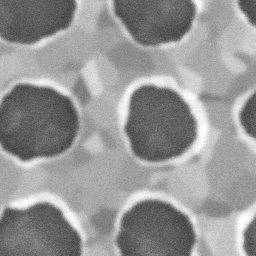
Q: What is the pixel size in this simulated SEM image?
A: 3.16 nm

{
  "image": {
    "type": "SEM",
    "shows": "holes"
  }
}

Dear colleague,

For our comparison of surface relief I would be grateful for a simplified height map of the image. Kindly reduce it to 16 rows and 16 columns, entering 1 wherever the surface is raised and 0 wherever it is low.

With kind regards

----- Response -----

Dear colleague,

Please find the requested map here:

0000011000001110
0000111100001111
0001111100011111
1111111111111111
1111111111111111
1000111100011111
0000011100001110
0000011100000110
0000011100000110
0000111100001111
1111111111111111
1111111111111111
1101111100111111
0000111100001110
0000011000001110
0000011000001110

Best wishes